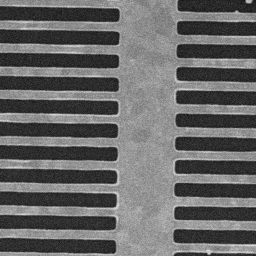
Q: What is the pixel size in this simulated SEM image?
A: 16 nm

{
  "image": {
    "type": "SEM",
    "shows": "groups of lines, slits or small figures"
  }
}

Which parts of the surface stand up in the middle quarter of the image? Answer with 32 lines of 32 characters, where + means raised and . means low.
..............++++++++++++++++++
++++++++++++++++++++++++++++....
++++++++++++++++++++++++++++....
.............+++++++++++++++....
..............+++++++++++++++.++
..............++++++++++++++++++
..............++++++++++++++....
++++++++++++++++++++++++++++....
++++++++++++++++++++++++++++....
..............++++++++++++++....
..............++++++++++++++++++
..............++++++++++++++++++
..............++++++++++++++....
++++++++++++++++++++++++++++....
++++++++++++++++++++++++++++....
.............+++++++++++++++....
..............++++++++++++++++++
..............++++++++++++++++++
+++.....++...+++++++++++++++....
+++++++++++++++++++++++++++.....
.......++++++++++++++++++++.....
.............+++++++++++++++....
..............++++++++++++++++++
.............+++++++++++++++++++
++++++++++++++++++++++++++++....
+++++++++++++++++++++++++++.....
.............++++++++++++++.....
..............++++++++++++++....
..............++++++++++++++++++
.............+++++++++++++++..++
+++++++++++++++++++++++++++.....
+++++++++++++++++++++++++++.....